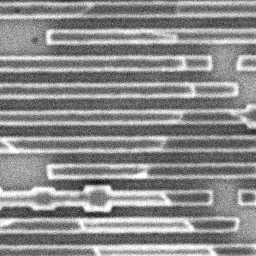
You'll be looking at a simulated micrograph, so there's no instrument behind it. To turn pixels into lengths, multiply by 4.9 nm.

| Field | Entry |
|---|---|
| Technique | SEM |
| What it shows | wiring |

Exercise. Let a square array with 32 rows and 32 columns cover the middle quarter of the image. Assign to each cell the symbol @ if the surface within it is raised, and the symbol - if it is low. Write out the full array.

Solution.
@@@@@@@@@@@@@@@@@@@@@@@@@@@@@@@@
@@@@@@@@@@---@@@@@@@------@@----
--------------------------------
--------------------------------
--------------------------------
@@@@@@@@@@@@@@@@@@@@@@@@@@@@@@@@
@@@@@@@@@@@@@@@@@@@@@@@@@@@@@@@@
@@@@@@@@@@@@@@@@@@@@@@@@@@@@@@@@
--------------------------------
--------------------------------
--------------------------------
--------------------------------
@@@@@@@@@@@@@@@@@@@@@@@@@@@@@@@@
@@@@@@@@@@@@@@@@@@@@@@@@@@@@@@@@
@@@@@@@@@@@@@@@@@@@@@@@@@@@@@@@@
--------------------------------
--------------------------------
--------------------------------
@@@@@@@@@@@@@@@@@@@@@@@@@@@@@@@@
@@@@@@@@@@@@@@@@@@@@@@@@@@@@@@@@
@@@@@@@@@@@@@@@@@@@@@@@@@@@@@@@@
@@@@@@@@@@@@@@@@@@@@@@@@@@@@@@@@
--------------------------------
--------------------------------
--------------------------------
@@@@@@@@@@@@@@@@@@@@@@@@@@@@@@@@
@@@@@@@@@@@@@@@@@@@@@@@@@@@@@@@@
@@@@@@@@@@@@@@@@@@@@@@@@@@@@@@@@
--------------------------------
--------------------------------
--------------------------------
-----@@@@@@@--------------------